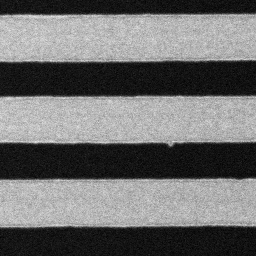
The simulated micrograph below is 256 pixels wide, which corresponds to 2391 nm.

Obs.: one or a few lines or trenches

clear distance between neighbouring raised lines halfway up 412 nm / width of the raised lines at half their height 361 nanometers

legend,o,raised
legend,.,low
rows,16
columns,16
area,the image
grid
oooooooooooooooo
................
................
................
oooooooooooooooo
oooooooooooooooo
................
................
................
oooooooooooooooo
oooooooooooooooo
................
................
................
oooooooooooooooo
oooooooooooooooo